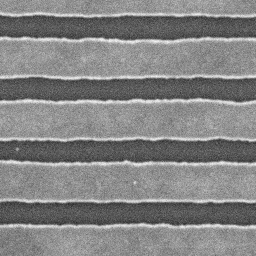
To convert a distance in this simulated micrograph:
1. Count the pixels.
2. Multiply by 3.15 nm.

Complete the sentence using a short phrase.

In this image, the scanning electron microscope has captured lines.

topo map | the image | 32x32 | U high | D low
UUUUUUUUUUUUUUUUUUUUUUUUUUUUUUUU
UUUUUUUUUUUUUUUUUUUUUUUUUUUUUUUU
DDDDDDDDDDDDDDDDDDDDDDDDDDDDDDDD
DDDDDDDDDDDDDDDDDDDDDDDDDDDDDDDD
DDDDDDDDDDDDDDDDDDDDDDDDDDDDDDDD
UUUUUUUUUUUUUUUUUUUUUUUUUUUUUUUU
UUUUUUUUUUUUUUUUUUUUUUUUUUUUUUUU
UUUUUUUUUUUUUUUUUUUUUUUUUUUUUUUU
UUUUUUUUUUUUUUUUUUUUUUUUUUUUUUUU
UUUUUUUUUUUUUUUUUUUUUUUUUUUUUUUU
DDDDDDDDDDDDDDDDDDDDDDDDDDDDDDDD
DDDDDDDDDDDDDDDDDDDDDDDDDDDDDDDD
DDDUDDDDDDDDDDDDDUDUDUUUUUUDDDDD
UUUUUUUUUUUUUUUUUUUUUUUUUUUUUUUU
UUUUUUUUUUUUUUUUUUUUUUUUUUUUUUUU
UUUUUUUUUUUUUUUUUUUUUUUUUUUUUUUU
UUUUUUUUUUUUUUUUUUUUUUUUUUUUUUUU
UUDDUUUUUUDUUUUDDDDUDDDUUUDDDDUU
DDDDDDDDDDDDDDDDDDDDDDDDDDDDDDDD
DDDDDDDDDDDDDDDDDDDDDDDDDDDDDDDD
UUUUUUUUUUUUUUUUUUUUUUUUUUUUUUUU
UUUUUUUUUUUUUUUUUUUUUUUUUUUUUUUU
UUUUUUUUUUUUUUUUUUUUUUUUUUUUUUUU
UUUUUUUUUUUUUUUUUUUUUUUUUUUUUUUU
UUUUUUUUUUUUUUUUUUUUUUUUUUUUUUUU
DDDDDDDDDDDDDDDDDDDDDDDDDDDDDDDD
DDDDDDDDDDDDDDDDDDDDDDDDDDDDDDDD
DDDDDDDDDDDDDDDDDDDDDDDDDDDDDDDD
UUUUUUUUUUUUUUUUUUUUUUUUUUUUUUUU
UUUUUUUUUUUUUUUUUUUUUUUUUUUUUUUU
UUUUUUUUUUUUUUUUUUUUUUUUUUUUUUUU
UUUUUUUUUUUUUUUUUUUUUUUUUUUUUUUU